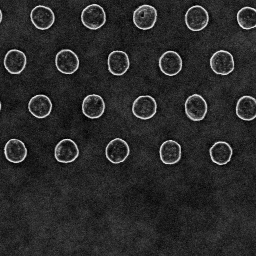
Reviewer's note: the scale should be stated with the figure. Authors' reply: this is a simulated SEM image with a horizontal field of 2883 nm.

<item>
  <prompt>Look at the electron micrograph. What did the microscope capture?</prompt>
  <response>a regular array of raised bodies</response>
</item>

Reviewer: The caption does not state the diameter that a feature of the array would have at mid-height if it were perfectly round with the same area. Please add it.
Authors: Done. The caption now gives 258 nanometers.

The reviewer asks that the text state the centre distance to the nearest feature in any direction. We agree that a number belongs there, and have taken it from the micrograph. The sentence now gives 0.572 micrometres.